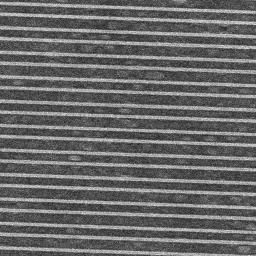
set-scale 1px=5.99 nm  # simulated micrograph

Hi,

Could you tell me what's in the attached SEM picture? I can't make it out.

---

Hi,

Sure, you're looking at parallel lines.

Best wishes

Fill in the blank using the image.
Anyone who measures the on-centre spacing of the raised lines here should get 73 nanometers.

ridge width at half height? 0.0142 microns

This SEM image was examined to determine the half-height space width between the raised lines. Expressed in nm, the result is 50.1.